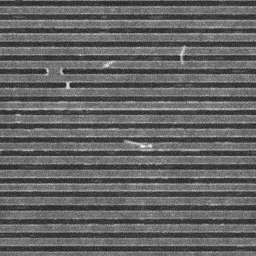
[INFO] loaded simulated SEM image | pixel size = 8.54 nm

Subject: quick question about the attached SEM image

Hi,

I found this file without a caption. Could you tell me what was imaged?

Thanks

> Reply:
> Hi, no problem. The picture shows parallel lines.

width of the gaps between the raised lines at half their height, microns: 0.0512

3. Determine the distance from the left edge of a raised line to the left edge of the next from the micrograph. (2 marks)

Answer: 13.6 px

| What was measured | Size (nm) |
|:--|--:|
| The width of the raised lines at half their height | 67.2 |